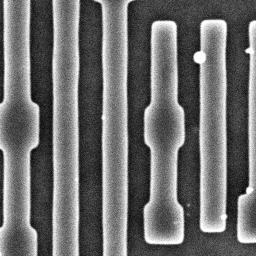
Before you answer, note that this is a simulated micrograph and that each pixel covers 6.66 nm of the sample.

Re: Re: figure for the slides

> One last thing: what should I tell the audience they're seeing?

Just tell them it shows wiring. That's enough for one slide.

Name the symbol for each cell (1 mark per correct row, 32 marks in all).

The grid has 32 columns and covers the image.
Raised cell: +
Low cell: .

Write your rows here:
.+++...+++...+++................
.+++...+++...+++................
.+++...+++...+++................
.+++...+++...+++...+++...+++...+
.+++...+++...+++...+++...+++...+
.+++...+++...+++...+++...+++...+
.+++...+++...+++...+++...+++...+
.+++...+++...+++...+++..++++...+
.+++...+++...+++...+++...+++...+
.+++...+++...+++...+++...+++...+
.+++...+++...+++...+++...+++...+
.+++...+++...+++...+++...+++...+
++++...+++...+++...+++...+++...+
+++++..+++...+++..+++++..+++...+
+++++..+++...+++..+++++..+++...+
+++++..+++...+++..+++++..+++...+
+++++..+++...+++..+++++..+++...+
+++++..+++...+++..+++++..+++...+
++++...+++...+++...+++...+++...+
++++...+++...+++...+++...+++...+
.+++...+++...+++...+++...+++...+
.+++...+++...+++...+++...+++...+
.+++...+++...+++...+++...+++...+
.+++...+++...+++...+++...+++...+
++++...+++...+++...+++...+++..++
++++...+++...+++..++++...+++..++
++++...+++...+++..+++++..+++..++
++++...+++...+++..+++++..+++..++
++++...+++...+++..+++++..+++..++
+++++..+++...+++..+++++.......++
+++++..+++...+++................
+++++..+++...+++................